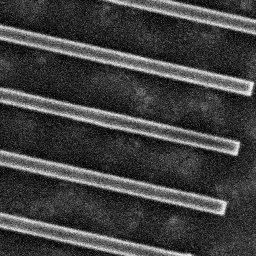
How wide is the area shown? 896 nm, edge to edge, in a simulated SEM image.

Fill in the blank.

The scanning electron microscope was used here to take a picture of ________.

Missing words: one or a few lines or trenches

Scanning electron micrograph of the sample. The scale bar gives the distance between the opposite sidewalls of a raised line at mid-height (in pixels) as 12.4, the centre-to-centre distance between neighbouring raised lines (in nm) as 214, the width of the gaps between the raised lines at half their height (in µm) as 0.171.